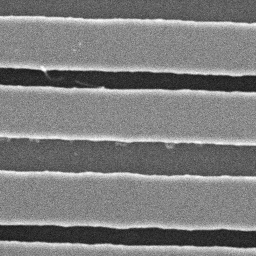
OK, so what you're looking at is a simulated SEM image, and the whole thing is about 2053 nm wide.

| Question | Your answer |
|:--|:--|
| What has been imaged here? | lines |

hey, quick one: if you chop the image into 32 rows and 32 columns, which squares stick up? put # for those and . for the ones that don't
................................
................................
#####################...........
################################
################################
################################
################################
################################
.###############################
................................
................................
###############################.
################################
################################
################################
################################
################################
...........#####################
................................
................................
................................
##...#..........................
################################
################################
################################
################################
################################
################################
..............###...############
................................
##########......................
################################